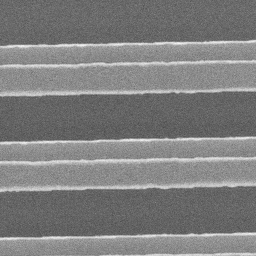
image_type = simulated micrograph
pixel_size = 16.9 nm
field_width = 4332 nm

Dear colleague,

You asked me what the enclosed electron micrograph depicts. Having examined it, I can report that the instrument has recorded lines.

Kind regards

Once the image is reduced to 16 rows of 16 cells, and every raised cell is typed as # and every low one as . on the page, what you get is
................
................
................
################
################
################
................
................
................
################
################
################
................
................
................
################